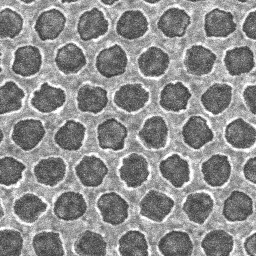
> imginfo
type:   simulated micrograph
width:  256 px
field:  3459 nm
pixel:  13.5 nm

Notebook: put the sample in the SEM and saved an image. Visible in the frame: a regular array of holes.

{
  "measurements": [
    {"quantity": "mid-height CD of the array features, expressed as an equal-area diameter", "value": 0.426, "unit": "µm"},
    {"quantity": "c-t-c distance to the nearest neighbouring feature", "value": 545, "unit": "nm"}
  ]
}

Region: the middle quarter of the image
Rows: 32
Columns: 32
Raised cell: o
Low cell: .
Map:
.....ooo........ooo.......oooo..
....oooo.......oooo.......ooooo.
...oooooo......ooooo.....oooooo.
oooooooooooooooooooooooooooooooo
oooooooooooooooooooooooooooo.ooo
oooo....ooooooo.....ooooo.....oo
ooo.......ooo.......oooo.......o
ooo........o.........ooo........
.oo........o.........ooo........
ooo........o.........ooo.......o
ooo........oo.......oooo.......o
oooo......ooooo....oooooo....ooo
ooooooo.oooooooooooooooooooooooo
oooooooooooo.oooooooo....oooooo.
....oooooo....oooooo.....ooooo..
.....ooo.......ooooo......oooo..
......oo....o...ooo.......ooo...
.....ooo.....o..oo........ooo...
.....ooo........oo........oooo..
.....oooo..o...oooo.......oooo..
....ooooo......ooooo.....oooooo.
...ooooooo.o..oooooooooooooooooo
oooooooooooooooo..ooooooooo.oooo
ooooo....oooooo.....ooooo.....oo
oooo......oooo.......ooo.......o
.oo........ooo.......ooo.......o
.oo........oo........ooo........
ooo........ooo.......ooo........
oooo......oooo.......oooo.......
oooo......ooooo.....oooooo.....o
ooooo....ooooooo...oooooooo...oo
oooooooooooooooooooooooooooooooo